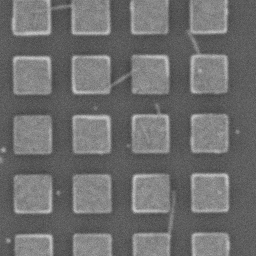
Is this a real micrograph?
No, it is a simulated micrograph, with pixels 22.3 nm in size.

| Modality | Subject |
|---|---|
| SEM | wiring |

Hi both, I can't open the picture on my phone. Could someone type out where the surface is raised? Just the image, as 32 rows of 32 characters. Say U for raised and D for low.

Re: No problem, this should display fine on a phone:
DDUUUUDDDUUUUUDDUUUUUDDDUUUUDDDD
DDUUUUDDDUUUUUDDDUUUUDDDUUUUDDDD
DDUUUUDDDUUUUUDDDUUUUDDDUUUUDDDD
DDUUUUDDDUUUUUDDDUUUUDDDUUUUDDDD
DDDDDDDDDDDDDDDDDDDDDDDDDDDDDDDD
DDDDDDDDDDDDDDDDDDDDDDDDDDDDDDDD
DDDDDDDDDDDDDDDDDDDDDDDDDDDDDDDD
DDUUUUDDDUUUUUDDDUUUUDDDUUUUDDDD
DDUUUUDDDUUUUUDDUUUUUDDDUUUUDDDD
DDUUUUDDDUUUUUDDUUUUUDDDUUUUDDDD
DDUUUUDDDUUUUUDDDUUUUDDDUUUUDDDD
DDUUUUDDDDUUUDDDDUUUUDDDUUUUDDDD
DDDDDDDDDDDDDDDDDDDDDDDDDDDDDDDD
DDDDDDDDDDDDDDDDDDDDDDDDDDDDDDDD
DDDDDDDDDDDDDDDDDDDUDDDDDUUUDDDD
DDUUUUDDDUUUUUDDDUUUUDDDUUUUDDDD
DDUUUUDDDUUUUUDDDUUUUDDDUUUUDDDD
DDUUUUDDDUUUUUDDDUUUUDDDUUUUDDDD
DDUUUUDDDUUUUUDDDUUUUDDDUUUUDDDD
DDDDDDDDDDDDDDDDDDDDDDDDDDDDDDDD
DDDDDDDDDDDDDDDDDDDDDDDDDDDDDDDD
DDDDDDDDDDDDDDDDDDDDDDDDDDDDDDDD
DDUUUUDDDUUUUUDDDUUUUDDDUUUUDDDD
DDUUUUDDDUUUUUDDDUUUUDDDUUUUDDDD
DDUUUUDDDUUUUUDDDUUUUDDDUUUUDDDD
DDUUUUDDDUUUUUDDDUUUUDDDUUUUDDDD
DDDDDDDDDDDDDDDDDDDDDDDDDDDDDDDD
DDDDDDDDDDDDDDDDDDDDDDDDDDDDDDDD
DDDDDDDDDDDDDDDDDDDDDDDDDDDDDDDD
DDUUUUDDDDUUUDDDDUUUUDDDDUUUDDDD
DDUUUUDDDUUUUUDDDUUUUDDDUUUUDDDD
DDUUUUDDDUUUUUDDDUUUUDDDUUUUDDDD